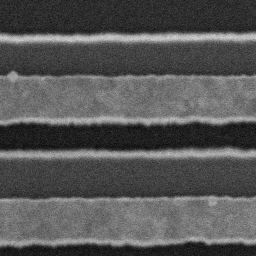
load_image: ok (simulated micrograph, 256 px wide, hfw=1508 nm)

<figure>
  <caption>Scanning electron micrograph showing lines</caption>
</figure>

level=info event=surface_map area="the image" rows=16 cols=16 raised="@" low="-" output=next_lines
----------------
----------------
@@@@@@@@@@@@@@@@
@@@@@@@@@@@@@@@@
@@@@@@@@@@@@@@@@
@@@@@@@@@@@@@@@@
@@@@@@@@@@@@@@@@
@--@@@---@---@--
----------------
----------------
@@@@@@@@@@@@@@@@
@@@@@@@@@@@@@@@@
@@@@@@@@@@@@@@@@
@@@@@@@@@@@@@@@@
@@@@@@@@@@@@@@@@
----------------